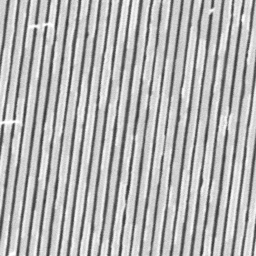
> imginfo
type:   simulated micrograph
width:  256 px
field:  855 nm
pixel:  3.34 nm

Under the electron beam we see parallel lines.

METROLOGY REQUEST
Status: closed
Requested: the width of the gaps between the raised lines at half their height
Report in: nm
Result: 9.5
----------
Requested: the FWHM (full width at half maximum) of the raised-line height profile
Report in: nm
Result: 22.3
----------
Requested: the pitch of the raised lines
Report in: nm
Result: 33.8